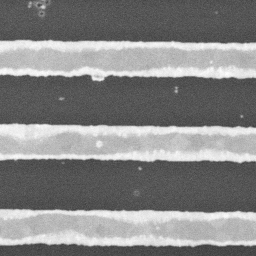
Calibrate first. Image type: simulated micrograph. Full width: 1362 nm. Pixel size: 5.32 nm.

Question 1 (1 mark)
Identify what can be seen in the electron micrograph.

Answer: lines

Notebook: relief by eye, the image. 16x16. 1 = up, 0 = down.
0000000000000000
0000000000000000
0000000000000000
1111111111111111
1111111111111111
0000000000000000
0000000000000000
0000000000000000
1111111111111111
1111111111111111
0000000000000000
0000000000000000
0000000000000000
1111111111111111
1111111111111111
0000000000000000